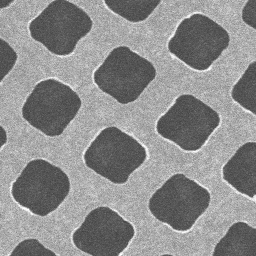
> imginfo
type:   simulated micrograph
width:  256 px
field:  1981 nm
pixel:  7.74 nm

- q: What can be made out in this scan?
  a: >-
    holes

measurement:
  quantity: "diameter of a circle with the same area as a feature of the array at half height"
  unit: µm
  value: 0.423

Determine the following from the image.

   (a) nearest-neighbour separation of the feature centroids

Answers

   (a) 0.618 micrometres